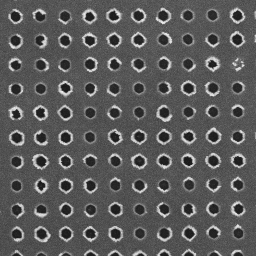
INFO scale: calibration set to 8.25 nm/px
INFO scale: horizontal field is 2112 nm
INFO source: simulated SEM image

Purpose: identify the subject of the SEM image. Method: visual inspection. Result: a regular array of holes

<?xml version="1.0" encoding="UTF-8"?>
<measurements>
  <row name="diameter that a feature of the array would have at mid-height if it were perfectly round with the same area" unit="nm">84.3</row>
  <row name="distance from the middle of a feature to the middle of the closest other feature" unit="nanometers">196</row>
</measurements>